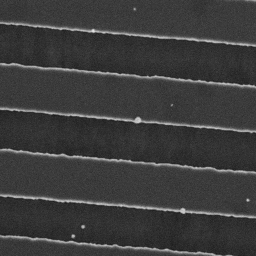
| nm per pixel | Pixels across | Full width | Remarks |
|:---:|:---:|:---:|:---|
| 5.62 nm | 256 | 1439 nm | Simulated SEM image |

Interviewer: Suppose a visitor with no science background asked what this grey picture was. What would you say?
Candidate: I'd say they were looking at lines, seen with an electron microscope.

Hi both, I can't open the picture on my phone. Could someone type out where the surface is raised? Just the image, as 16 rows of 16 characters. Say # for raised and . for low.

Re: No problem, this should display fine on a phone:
################
################
............####
................
######..........
################
################
.......#########
................
##..............
#############...
################
...#############
..............##
................
#########.......